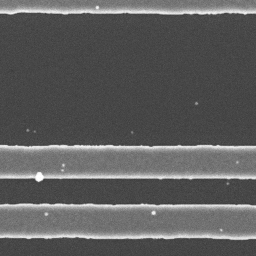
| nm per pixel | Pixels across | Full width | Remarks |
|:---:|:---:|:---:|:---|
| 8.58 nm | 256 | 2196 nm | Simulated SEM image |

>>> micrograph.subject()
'lines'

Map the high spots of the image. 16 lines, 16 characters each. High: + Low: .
++++++++++++++++
................
................
................
................
................
................
................
................
++++++++++++++++
++++++++++++++++
................
................
++++++++++++++++
++++++++++++++++
................